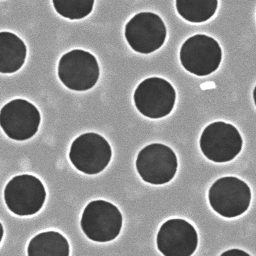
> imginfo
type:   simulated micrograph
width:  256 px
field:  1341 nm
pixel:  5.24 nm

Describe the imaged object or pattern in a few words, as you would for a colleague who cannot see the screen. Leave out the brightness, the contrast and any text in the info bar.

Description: a regular array of holes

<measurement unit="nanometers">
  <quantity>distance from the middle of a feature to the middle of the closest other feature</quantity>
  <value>338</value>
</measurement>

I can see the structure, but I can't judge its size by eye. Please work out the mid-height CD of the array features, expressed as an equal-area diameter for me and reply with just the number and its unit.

220 nm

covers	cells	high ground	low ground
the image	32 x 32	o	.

ooooooo.....oooooooooo.....ooooo
ooooooo....ooooooo.ooo.....ooooo
oooooooooooooooo....ooo...oooooo
oooooooooooooooo.....ooooooooooo
..oooooooooooooo.....ooo..oooooo
...ooooooooooooo....ooo....ooooo
...ooooo...oooooo..ooo......oooo
...oooo.....ooooooooooo.....oooo
...oooo.....ooooooooooo....ooooo
ooooooo.....ooooooooooooo.oooooo
oooooooo....ooooo....ooooooooooo
ooooooooooooooooo.....oooooooooo
oo.oooooooooooooo.....oooooooooo
.....oooooooooooo.....oooooooooo
.....ooooooooooooo...ooooooooooo
.....ooooooooooooooooooooo...ooo
o....oooooooooooooooooooo.....oo
oo.oooooo....oooooooooooo.....oo
ooooooooo.....oooo...oooo.....oo
ooooooooo.....ooo.....oooo....oo
ooooooooo.....ooo.....oooooooooo
oooooooooo..ooooo.....oooooooooo
o....ooooooooooooo...oooooo...oo
o.....oooooooooooooooooooo.....o
......oooooooooooooooooooo.....o
o....oooooo...oooooooooooo.....o
oo...ooooo.....oooooooooooo....o
oooooooooo.....oooooo..ooooooooo
oooooooooo.....ooooo....oooooooo
oooo....ooo....ooooo.....ooooooo
oooo.....ooooooooooo.....ooooooo
ooo......ooooooooooo....oooo...o